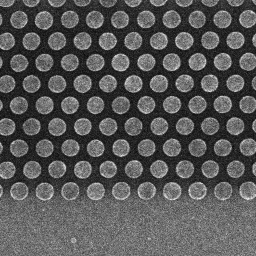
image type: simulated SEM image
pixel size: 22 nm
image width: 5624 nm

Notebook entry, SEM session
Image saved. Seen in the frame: a regular array of raised bodies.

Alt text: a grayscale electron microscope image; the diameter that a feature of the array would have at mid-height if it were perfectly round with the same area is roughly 386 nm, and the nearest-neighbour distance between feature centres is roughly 542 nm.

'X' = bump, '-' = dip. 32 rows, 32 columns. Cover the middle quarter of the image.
XXX---XXXX--XXXX---XXX---XXXX--X
-X-----XX----XX-----XX----XX----
--------------------------------
---XXX----XXX---XXX---XXX----XXX
--XXXXX--XXXX--XXXX---XXXX--XXXX
--XXXXX--XXXX--XXXXX--XXXX--XXXX
---XXX----XX----XXX---XXX----XX-
--------------------------------
XX-----XX----XX----XXX----XX----
XXXX--XXXX--XXXX---XXXX--XXXX--X
XXXX--XXXX--XXXX---XXXX--XXXX--X
XXX---XXXX--XXXX---XXX---XXXX---
--------------------------------
-----------------X--------------
---XXX---XXXX---XXX---XXXX--XXXX
---XXXX--XXXX--XXXXX--XXXX--XXXX
---XXXX--XXXX--XXXX---XXXX--XXXX
----XX----XX----XXX----XX----XX-
--------------------------------
XXX----XX----XXX---XXX----XXX---
XXXX--XXXX--XXXX---XXXX--XXXX--X
XXXX--XXXX--XXXX---XXXX--XXXX--X
XXX---XXX----XXX---XXX----XXX---
--------------------------------
----XX----XX----XXX----XX----XX-
---XXXX--XXXX---XXXX--XXXX--XXXX
---XXXX--XXXX--XXXXX--XXXX--XXXX
---XXXX--XXXX---XXX---XXX---XXXX
----X---------------------------
--------------------------------
XXX---XXXX---XXX---XXXX--XXXX---
XXXX--XXXX--XXXX---XXXX--XXXX--X